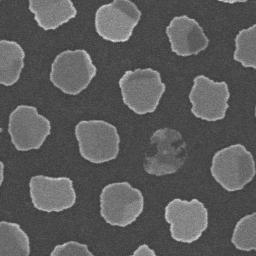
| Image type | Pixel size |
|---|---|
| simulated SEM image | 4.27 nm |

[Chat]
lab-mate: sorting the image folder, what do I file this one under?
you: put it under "a regular array of raised bodies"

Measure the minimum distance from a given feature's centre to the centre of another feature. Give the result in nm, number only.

288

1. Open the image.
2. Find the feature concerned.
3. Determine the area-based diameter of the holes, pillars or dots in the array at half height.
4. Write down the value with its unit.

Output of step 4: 181 nanometers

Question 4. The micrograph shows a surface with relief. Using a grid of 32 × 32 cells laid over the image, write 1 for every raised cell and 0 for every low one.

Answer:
00001111100000111000000000000000
00001111100011111000000000000000
00000111100011111000001100000000
00000110000011111000011110000001
00000000000001110000011111000011
11000000000000000000011111000111
11100000111000000000001110000111
11100001111000000000000000000011
11100011111100000000000000000000
11000011111100011111000000000000
10000001111000011111000011110000
00000000110000011111000011111000
00000000000000011111000011110000
00110000000000001110000011110000
01111000000000000000000001110000
01111100001111000000000000000000
01111100011111100000000000000000
00111000001111100000000000000000
00111000001111100000000000001110
00000000001111000000000000011110
00000000000000000000000000011111
00000000000000000000000000111111
00001111100000000000000000011110
00001111100001111000000000001100
00001111100001111100000000000000
00001111100001111100011110000000
00000000000001111100011111000000
00000000000001111000011111000011
11000000000000000000011111000111
11100000000000000000001110000111
11110000110000000000000000000111
11110001111000000110000000000000